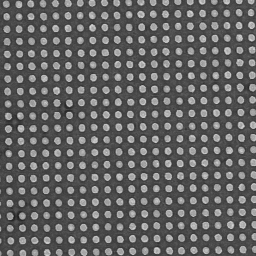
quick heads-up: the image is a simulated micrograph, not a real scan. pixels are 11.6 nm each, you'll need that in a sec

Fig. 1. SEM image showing a regular array of raised bodies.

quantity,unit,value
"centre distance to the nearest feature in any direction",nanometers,140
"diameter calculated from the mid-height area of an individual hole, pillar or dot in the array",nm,82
